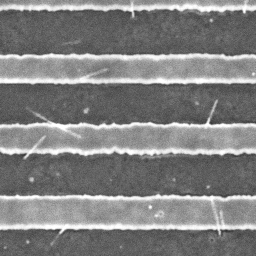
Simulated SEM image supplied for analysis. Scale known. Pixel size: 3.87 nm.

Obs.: lines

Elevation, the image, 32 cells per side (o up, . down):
oooooooooooooooooooooooooooooooo
................................
................................
................................
................................
................................
................................
oooooooooooooooooooooooooooooooo
oooooooooooooooooooooooooooooooo
oooooooooooooooooooooooooooooooo
................................
................................
................................
................................
................................
..o.oooo.oo...o.oooo.ooo.ooo.ooo
oooooooooooooooooooooooooooooooo
oooooooooooooooooooooooooooooooo
oooooooooooooooooooooooooooooooo
................................
................................
................................
................................
................................
o.ooooooooooo......ooooo.o...ooo
oooooooooooooooooooooooooooooooo
oooooooooooooooooooooooooooooooo
oooooooooooooooooooooooooooooooo
oooooooooooooooooooooooooooooooo
................................
................................
................................